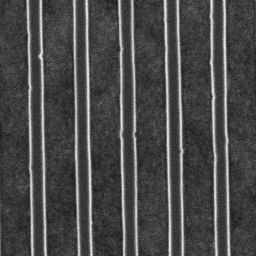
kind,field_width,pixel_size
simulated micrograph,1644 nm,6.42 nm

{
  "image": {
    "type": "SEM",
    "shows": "parallel lines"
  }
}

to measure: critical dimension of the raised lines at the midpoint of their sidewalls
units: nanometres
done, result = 85.8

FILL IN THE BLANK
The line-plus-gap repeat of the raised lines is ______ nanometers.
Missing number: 294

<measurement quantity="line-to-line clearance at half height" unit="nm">209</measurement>